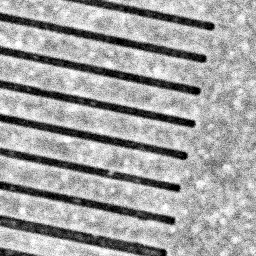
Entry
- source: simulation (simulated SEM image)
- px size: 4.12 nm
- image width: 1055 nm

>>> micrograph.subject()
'parallel lines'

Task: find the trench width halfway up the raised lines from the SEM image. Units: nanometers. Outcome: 38.9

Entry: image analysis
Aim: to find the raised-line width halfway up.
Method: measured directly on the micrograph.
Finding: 99.4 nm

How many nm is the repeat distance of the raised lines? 136